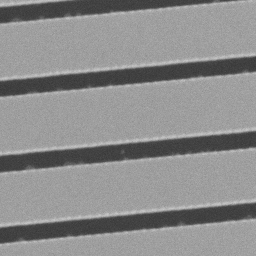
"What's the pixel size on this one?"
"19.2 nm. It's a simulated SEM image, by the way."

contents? lines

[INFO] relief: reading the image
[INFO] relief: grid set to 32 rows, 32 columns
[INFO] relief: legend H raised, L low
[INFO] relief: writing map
HHHHLLLLLLLLLLLLLLLLLLLLLLHHHHHH
LLLLLLLLLLLLLLLLHHHHHHHHHHHHHHHH
LLLLLHHHHHHHHHHHHHHHHHHHHHHHHHHH
HHHHHHHHHHHHHHHHHHHHHHHHHHHHHHHH
HHHHHHHHHHHHHHHHHHHHHHHHHHHHHHHH
HHHHHHHHHHHHHHHHHHHHHHHHHHHHHHHH
HHHHHHHHHHHHHHHHHHHHHHHHHHHHHHHH
HHHHHHHHHHHHHHHHHHHHHHHHHHHLLLLL
HHHHHHHHHHHHHHHHHLLLLLLLLLLLLLLL
HHHHHHHLLLLLLLLLLLLLLLLLLLLLHHHH
LLLLLLLLLLLLLLLLLHHHHHHHHHHHHHHH
LLLLLLLHHHHHHHHHHHHHHHHHHHHHHHHH
HHHHHHHHHHHHHHHHHHHHHHHHHHHHHHHH
HHHHHHHHHHHHHHHHHHHHHHHHHHHHHHHH
HHHHHHHHHHHHHHHHHHHHHHHHHHHHHHHH
HHHHHHHHHHHHHHHHHHHHHHHHHHHHHHHH
HHHHHHHHHHHHHHHHHHHHHHHHHHHHHHLL
HHHHHHHHHHHHHHHHHHHHLLLLLLLLLLLL
HHHHHHHHHHLLLLLLLLLLLLLLLLLLLLLL
LLLLLLLLLLLLLLLLLLLLLHHHHHHHHHHH
LLLLLLLLLLLHHHHHHHHHHHHHHHHHHHHH
LHHHHHHHHHHHHHHHHHHHHHHHHHHHHHHH
HHHHHHHHHHHHHHHHHHHHHHHHHHHHHHHH
HHHHHHHHHHHHHHHHHHHHHHHHHHHHHHHH
HHHHHHHHHHHHHHHHHHHHHHHHHHHHHHHH
HHHHHHHHHHHHHHHHHHHHHHHHHHHHHHLL
HHHHHHHHHHHHHHHHHHHLLLLLLLLLLLLL
HHHHHHHHHLLLLLLLLLLLLLLLLLLLLLLH
LLLLLLLLLLLLLLLLLLLLHHHHHHHHHHHH
LLLLLLLLLLHHHHHHHHHHHHHHHHHHHHHH
HHHHHHHHHHHHHHHHHHHHHHHHHHHHHHHH
HHHHHHHHHHHHHHHHHHHHHHHHHHHHHHHH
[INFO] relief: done